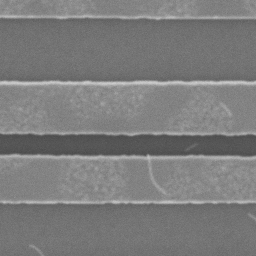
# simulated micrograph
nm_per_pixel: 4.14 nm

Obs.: lines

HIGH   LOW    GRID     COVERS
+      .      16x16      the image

++++++++++++++++
................
................
................
................
++++++++++++++++
++++++++++++++++
++++++++++++++++
................
................
++++++++++++++++
++++++++++++++++
++++++++++++++++
................
................
................